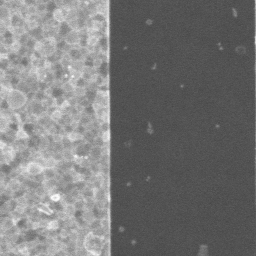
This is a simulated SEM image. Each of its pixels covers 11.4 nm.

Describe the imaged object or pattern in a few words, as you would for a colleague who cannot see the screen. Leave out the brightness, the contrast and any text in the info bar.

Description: wiring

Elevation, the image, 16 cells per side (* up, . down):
*******.........
*******.........
*******.........
*******.........
*******.........
*******.........
*******.........
*******.........
*******.........
*******.........
*******.........
*******.........
*******.........
*******.........
*******.........
*******.........